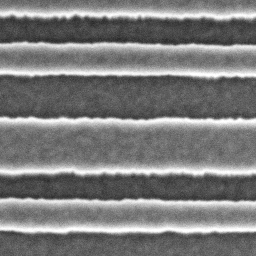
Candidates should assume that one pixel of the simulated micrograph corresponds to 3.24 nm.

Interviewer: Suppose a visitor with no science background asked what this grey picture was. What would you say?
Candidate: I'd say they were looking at lines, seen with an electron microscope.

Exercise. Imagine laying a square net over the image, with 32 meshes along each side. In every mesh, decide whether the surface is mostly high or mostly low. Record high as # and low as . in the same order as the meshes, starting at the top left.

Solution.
################################
################################
................................
................................
................................
..##.#..........................
################################
################################
################################
................................
................................
................................
................................
................................
................................
################################
################################
################################
################################
################################
################################
#######...###.##.####..#########
................................
................................
................................
################################
################################
################################
################################
................................
................................
................................